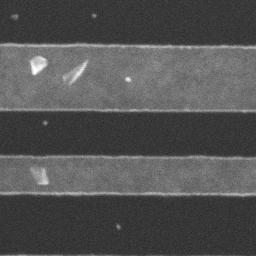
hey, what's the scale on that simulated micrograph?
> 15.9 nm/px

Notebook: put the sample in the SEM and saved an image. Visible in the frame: lines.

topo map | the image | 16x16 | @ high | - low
@@@@@@@@@@@@@@@@
@@@@@@@@@@@@@@@@
@@@@@@@@@@@@@@@@
----------------
----------------
----------------
----------------
@@@@@@@@@@@@@@@@
@@@@@@@@@@@@@@@@
@@@@@@@@@@@@@@@@
----------------
----------------
@@@@@@@@@@@@@@@@
@@@@@@@@@@@@@@@@
@@@@@@@@@@@@@@@@
@@@@@@@@@@@@@@@@